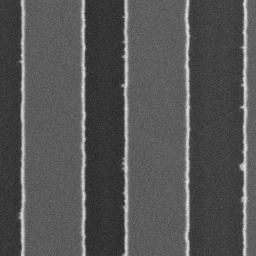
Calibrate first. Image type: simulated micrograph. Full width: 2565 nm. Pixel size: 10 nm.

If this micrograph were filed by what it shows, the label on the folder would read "lines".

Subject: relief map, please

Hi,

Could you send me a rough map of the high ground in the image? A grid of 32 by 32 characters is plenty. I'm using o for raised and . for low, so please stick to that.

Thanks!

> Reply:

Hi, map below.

...oooooooo.....oooooooo......oo
...oooooooo.....ooooooo........o
...oooooooo.....ooooooo........o
...oooooooo.....oooooooo.......o
...oooooooo.....oooooooo......oo
...oooooooo.....oooooooo.......o
...oooooooo.....ooooooo........o
...oooooooo.....ooooooo........o
...oooooooo.....oooooooo......oo
...oooooooo.....oooooooo......oo
...oooooooo.....oooooooo.......o
...oooooooo.....oooooooo.......o
...oooooooo.....oooooooo.......o
...oooooooo.....oooooooo......oo
...oooooooo.....oooooooo.......o
...oooooooo.....oooooooo......oo
...oooooooo.....oooooooo.......o
...oooooooo.....oooooooo......oo
...oooooooo.....oooooooo.......o
...oooooooo.....oooooooo.......o
...oooooooo.....oooooooo......oo
...oooooooo.....oooooooo......oo
...oooooooo.....oooooooo.......o
...oooooooo.....oooooooo......oo
...oooooooo.....oooooooo......oo
...oooooooo.....oooooooo.......o
...oooooooo.....oooooooo......oo
...oooooooo.....oooooooo......oo
...oooooooo.....oooooooo......oo
...oooooooo.....ooooooo.......oo
...oooooooo.....oooooooo......oo
...oooooooo.....oooooooo......oo